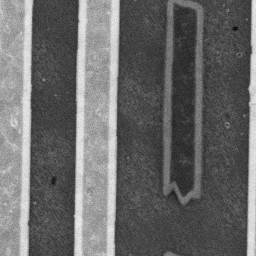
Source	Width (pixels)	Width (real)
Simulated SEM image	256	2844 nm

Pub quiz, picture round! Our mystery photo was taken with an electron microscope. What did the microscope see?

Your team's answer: one or a few lines or trenches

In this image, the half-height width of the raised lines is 0.351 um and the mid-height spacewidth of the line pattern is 610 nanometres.